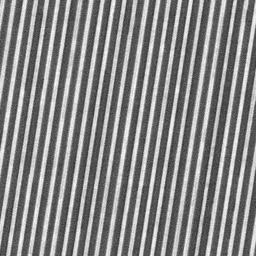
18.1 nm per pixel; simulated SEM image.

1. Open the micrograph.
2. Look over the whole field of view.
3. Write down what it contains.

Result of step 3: parallel lines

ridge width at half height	0.0537	microns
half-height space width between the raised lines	143	nm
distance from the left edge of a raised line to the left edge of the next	0.198	microns